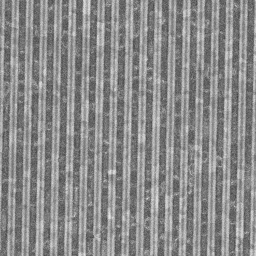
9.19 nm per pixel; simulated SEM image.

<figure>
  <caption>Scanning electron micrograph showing parallel lines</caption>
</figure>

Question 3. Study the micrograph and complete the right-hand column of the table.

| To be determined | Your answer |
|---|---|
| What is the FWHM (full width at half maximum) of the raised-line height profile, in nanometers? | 42.5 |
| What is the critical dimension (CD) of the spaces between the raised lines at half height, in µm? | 0.0839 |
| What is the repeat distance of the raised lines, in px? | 14.3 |